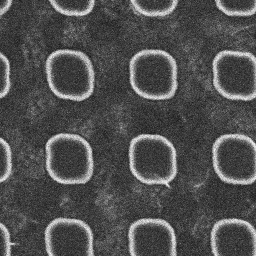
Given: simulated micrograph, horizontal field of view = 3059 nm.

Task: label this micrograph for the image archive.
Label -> raised bodies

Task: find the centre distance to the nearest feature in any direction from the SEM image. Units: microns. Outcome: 0.998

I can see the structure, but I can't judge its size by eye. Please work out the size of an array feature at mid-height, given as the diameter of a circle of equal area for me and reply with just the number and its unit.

566 nm